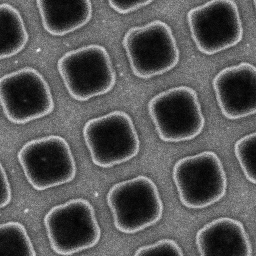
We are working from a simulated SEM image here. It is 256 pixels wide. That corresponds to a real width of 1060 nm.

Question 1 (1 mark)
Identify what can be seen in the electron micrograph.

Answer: a regular array of raised bodies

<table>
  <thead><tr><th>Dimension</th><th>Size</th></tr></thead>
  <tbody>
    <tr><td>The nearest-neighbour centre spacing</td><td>282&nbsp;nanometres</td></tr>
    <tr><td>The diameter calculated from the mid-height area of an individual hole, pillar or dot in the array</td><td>0.22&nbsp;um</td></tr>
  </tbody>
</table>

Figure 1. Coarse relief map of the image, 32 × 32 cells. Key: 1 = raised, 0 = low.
00000111111000111100000000111000
11000111111000000000000011111100
11100111111000000000000011111100
11100011110000000111100011111100
11100000000000001111100011111100
11100000000000001111110001111000
11000000011110001111110000100000
00000000111111001111110000000000
00000001111111000111100000000111
01111000111111000010000000011111
11111100111111000000000000011111
11111100011110000000011100011111
11111100000000000001111110011111
01111100000000000001111110001111
01111000000001110001111110001100
00000000000111111000111110000000
00000000000111111000111110000000
00000111000111111000010000000011
00011111100111111000000000000011
00111111100011111000000011100011
00011111100011000000001111100011
10011111100000000000001111110001
10001111100000001110001111110001
10000100000000111110001111110000
10000000000000111111000111110000
10000000111000111111000111000000
00000011111100111111000000000000
00000011111100111111000000011000
11100011111100011100000000111100
11100011111100000000000001111110
11110001111100000001110001111110
11110001100000000111111001111110